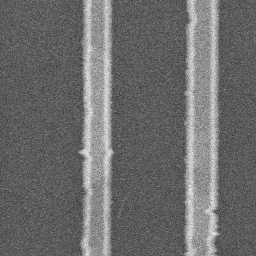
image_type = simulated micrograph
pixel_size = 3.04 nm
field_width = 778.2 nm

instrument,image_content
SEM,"one or a few lines or trenches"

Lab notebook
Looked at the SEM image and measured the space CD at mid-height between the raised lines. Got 0.258 µm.